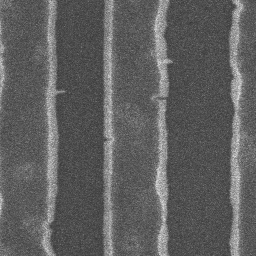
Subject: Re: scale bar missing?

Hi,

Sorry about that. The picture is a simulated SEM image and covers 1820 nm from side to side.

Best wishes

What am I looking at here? one or a few lines or trenches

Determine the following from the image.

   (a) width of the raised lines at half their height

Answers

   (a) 394 nm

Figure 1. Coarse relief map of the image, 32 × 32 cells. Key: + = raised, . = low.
+++++++.......++++++.........+++
+++++++.......++++++.........+++
+++++++.......++++++.........+++
++++++........++++++.........+++
+++++++......+++++++.........+++
++++++.......+++++++.........+++
+++++++......+++++++.........+++
+++++++......++++++++........+++
+++++++......+++++++.........+++
+++++++......++++++++........+++
++++++.......+++++++..........++
+++++++......+++++++..........++
++++++.......+++++++.........+++
++++++.......+++++++..........++
+++++++......+++++++..........++
+++++++.......++++++..........++
+++++++.......++++++.........+++
+++++++.......++++++.........+++
+++++++.......++++++.........+++
+++++++.......++++++.........+++
+++++++......+++++++.........+++
+++++++......+++++++.........+++
++++++.......+++++++.........+++
++++++.......+++++++.........+++
++++++.......+++++++.........+++
++++++.......++++++++........+++
++++++.......++++++++.........++
++++++.......++++++++........+++
++++++.......++++++++........+++
++++++.......++++++++........+++
++++++........++++++.........+++
++++++........++++++.........+++